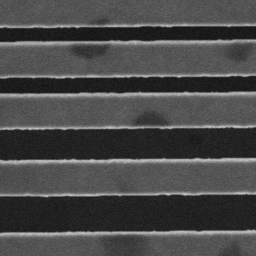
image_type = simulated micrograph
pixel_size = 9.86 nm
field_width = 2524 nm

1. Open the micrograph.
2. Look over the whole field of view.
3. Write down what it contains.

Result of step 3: lines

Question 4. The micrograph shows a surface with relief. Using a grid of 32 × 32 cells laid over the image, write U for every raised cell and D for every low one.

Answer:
UUUUUUUUUUUUUUUUUUUUUUUUUUUUUUUU
UUUUUUUUUUUUUUUUUUUUUUUUUUUUUUUU
UUUUUUUUUUUUUUUUUUUUUUUUUUUUUUUU
DDDDDDDDDDDDDDDDDDDDDDDDDDDDDDDD
DDDDDDDDDDDDDDDDDDDDDDDDDDDDDDDD
UUUUUUUUUUUUUUUUUUUUUUUUUUUUUUUU
UUUUUUUUUUUUUUUUUUUUUUUUUUUUUUUU
UUUUUUUUUUUUUUUUUUUUUUUUUUUUUUUU
UUUUUUUUUUUUUUUUUUUUUUUUUUUUUUUU
UUUUUUUUUUUUUUUUUUUUUUUUUUUUUDUD
DDDDDDDDDDDDDDDDDDDDDDDDDDDDDDDD
DDDDDDDDDDDDDDDDDDDDDDDDDDDDDDDD
UUUUUUUUUUUUUUUUUUUUUUUUUUUUUUUU
UUUUUUUUUUUUUUUUUUUUUUUUUUUUUUUU
UUUUUUUUUUUUUUUUUUUUUUUUUUUUUUUU
UUUUUUUUUUUUUUUUUUUUUUUUUUUUUUUU
DDDDDDDDDDDDDDDDDDDDDDDDDDDDDDDD
DDDDDDDDDDDDDDDDDDDDDDDDDDDDDDDD
DDDDDDDDDDDDDDDDDDDDDDDDDDDDDDDD
DDDDDDDDDDDDDDDDDDDDDDDDDDDDDDDD
UUUUUUUUUUUUUUUUUUUUUUUUUUUUUUUU
UUUUUUUUUUUUUUUUUUUUUUUUUUUUUUUU
UUUUUUUUUUUUUUUUUUUUUUUUUUUUUUUU
UUUUUUUUUUUUUUUUUUUUUUUUUUUUUUUU
DDDDDUDDDDDDDDDDDDDDDDDDDDDDDDDD
DDDDDDDDDDDDDDDDDDDDDDDDDDDDDDDD
DDDDDDDDDDDDDDDDDDDDDDDDDDDDDDDD
DDDDDDDDDDDDDDDDDDDDDDDDDDDDDDDD
DDDDDDDDDDDDDDDDDDDDDDDDDDDDDDDD
UUUUUUUUUUUUUUUUUUUUUUUUUUUUUUUU
UUUUUUUUUUUUUUUUUUUUUUUUUUUUUUUU
UUUUUUUUUUUUUUUUUUUUUUUUUUUUUUUU